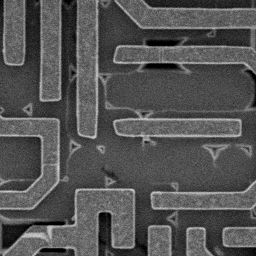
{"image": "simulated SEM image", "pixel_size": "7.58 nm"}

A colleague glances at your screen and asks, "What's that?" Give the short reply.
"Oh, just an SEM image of wiring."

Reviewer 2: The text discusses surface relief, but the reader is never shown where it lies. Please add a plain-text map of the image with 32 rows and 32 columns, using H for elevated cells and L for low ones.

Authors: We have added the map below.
LHHLLHHHLLHHLLLHHHLLLLLLLLLLLLLL
LHHLLHHHLLHHLLLLHHHHHHHHHHHHHHHH
LHHLLHHHLLHHLLLLLHHHHHHHHHHHHHHH
LHHLLHHHLLHHLLLLLLLLLLLLLLLLLLLL
LHHLLHHHLLHHLLLLLLLLLLLLLLLLLLLL
LHHLLHHHLLHHLLLLLLLLLLLLLLLLLLLL
LHHLLHHHLLHHLLHHHHHHHHHHHHHHHHHH
LHHLLHHHLLHHLLHHHHHHHHHHHHHHHHHH
LLLLLHHHLLHHLLLLLLLLLLLLLLLLLLLH
LLLLLHHHLLHHLLLLLLLLLLLLLLLLLLLL
LLLLLHHHLLHHLLLLLLLLLLLLLLLLLLLL
LLLLLHHHLLHHLLLLLLLLLLLLLLLLLLLL
LLLLLHHLLLHHLLLLLLLLLLLLLLLLLLLL
LLLLLLLLLLHHLLLLLLLLLLLLLLLLLLLL
LLLLLLLLLLHHLLLLLLLLLLLLLLLLLLLL
HHHHHHHLLLHHLLHHHHHHHHHHHHHHHHLL
HHHHHHHLLLHHLLLHHHHHHHHHHHHHHHLL
LLLLLHHLLLLLLLLLLLLLLLLLLLLLLLLL
LLLLLHHLLLLLLLLLLLLLLLLLLLLLLLLL
LLLLLHHLLLLLLLLLLLLLLLLLLLLLLLLL
LLLLLHHLLLLLLLLLLLLLLLLLLLLLLLLL
LLLLLHHLLLLLLLLLLLLLLLLLLLLLLLLL
LLLLLHHLLLLLLLLLLLLLLLLLLLLLLLLL
LLLLHHHLLLLLLLLLLLLLLLLLLLLLLLLH
HHHHHHLLLHHHHHHHHLLHHHHHHHHHHHHH
HHHHHLLLLHHHHHHHHLLHHHHHHHHHHHHH
LLLLLLLLLHHHHHHHHLLLLLLLLLLLLLLL
LLLLLLLLLHHHLLHHHLLLLLLLLLLLLLLL
LLLLLLHHHHHHLLHHHLLHHLLLLLLLLLLL
LLLHHHHHHHHHLLHHHLLHHLLHHHLLHHHH
LLHHHHHHHHHHLLHHHLLHHLLHHHLLHHHH
LHHHHLLLLHHHLLLLLLLHHLLHHHLLLLLL